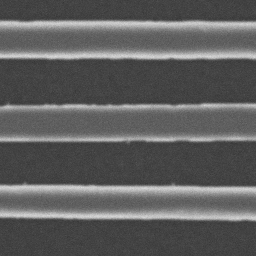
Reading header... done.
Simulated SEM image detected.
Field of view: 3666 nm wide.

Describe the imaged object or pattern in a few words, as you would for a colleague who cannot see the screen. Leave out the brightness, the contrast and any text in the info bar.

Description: lines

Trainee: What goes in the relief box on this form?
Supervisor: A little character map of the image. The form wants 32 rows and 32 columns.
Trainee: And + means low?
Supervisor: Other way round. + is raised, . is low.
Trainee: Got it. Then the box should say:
................................
................................
................................
++++++++++++++++++++++++++++++++
++++++++++++++++++++++++++++++++
++++++++++++++++++++++++++++++++
++++++++++++++++++++++++++++++++
................................
................................
................................
................................
................................
................................
++++++++++++++++++++++++++++++++
++++++++++++++++++++++++++++++++
++++++++++++++++++++++++++++++++
++++++++++++++++++++++++++++++++
++++++++++++++++..++++.++++.....
................................
................................
................................
................................
................................
+++++++++++++++.................
++++++++++++++++++++++++++++++++
++++++++++++++++++++++++++++++++
++++++++++++++++++++++++++++++++
................................
................................
................................
................................
................................